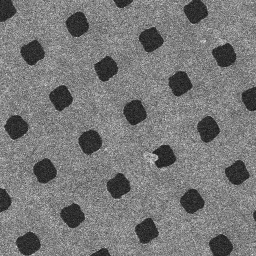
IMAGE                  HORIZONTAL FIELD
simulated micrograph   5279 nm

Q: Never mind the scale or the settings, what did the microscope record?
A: a regular array of holes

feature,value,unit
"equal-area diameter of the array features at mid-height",483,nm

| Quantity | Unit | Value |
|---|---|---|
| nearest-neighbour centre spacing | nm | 1080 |